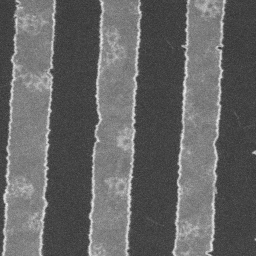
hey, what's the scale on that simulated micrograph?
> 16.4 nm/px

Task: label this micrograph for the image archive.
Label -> one or a few lines or trenches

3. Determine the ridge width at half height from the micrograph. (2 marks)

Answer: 0.601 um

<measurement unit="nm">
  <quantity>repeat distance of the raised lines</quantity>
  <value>1400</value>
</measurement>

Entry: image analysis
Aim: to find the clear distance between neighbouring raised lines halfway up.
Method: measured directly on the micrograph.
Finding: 0.787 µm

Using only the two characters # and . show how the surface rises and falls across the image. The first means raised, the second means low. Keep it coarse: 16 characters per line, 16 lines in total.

.##...###...##..
.##...###...##..
.##...###...##..
.##...###...##..
.##...###...##..
.##...##....##..
.##...##...###..
.##...##...###..
.##...##...###..
###...##...##...
.##...##...##...
###...##...##...
###...##...##...
###...##...##...
###...##...##...
###...##...##...